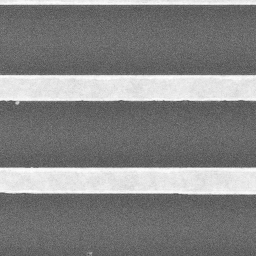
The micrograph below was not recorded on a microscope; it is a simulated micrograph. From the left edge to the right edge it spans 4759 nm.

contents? lines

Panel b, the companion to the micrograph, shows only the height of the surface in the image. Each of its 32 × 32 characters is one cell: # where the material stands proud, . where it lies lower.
................................
................................
................................
................................
................................
................................
................................
................................
................................
################################
################################
################################
################################
................................
................................
................................
................................
................................
................................
................................
................................
################################
################################
################################
................................
................................
................................
................................
................................
................................
................................
................................